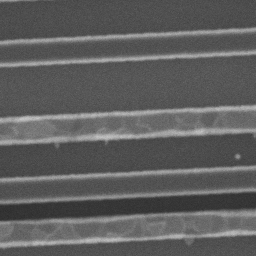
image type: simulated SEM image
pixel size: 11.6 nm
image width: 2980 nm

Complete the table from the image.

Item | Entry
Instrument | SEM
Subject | lines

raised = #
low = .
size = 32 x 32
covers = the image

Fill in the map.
................................
................................
................................
................................
.............###################
################################
################################
################................
................................
................................
................................
................................
................................
...........................#####
.......#########################
################################
###############################.
##########......................
................................
................................
................................
..................##############
################################
################################
####################............
................................
........................########
.....###########################
################################
##########################......
#######.........................
................................